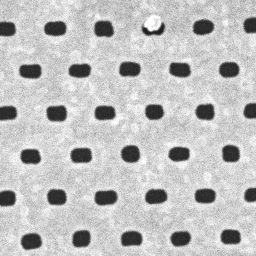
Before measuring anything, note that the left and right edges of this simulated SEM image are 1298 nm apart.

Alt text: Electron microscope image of a regular array of holes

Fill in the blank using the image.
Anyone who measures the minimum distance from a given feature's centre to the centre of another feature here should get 244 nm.